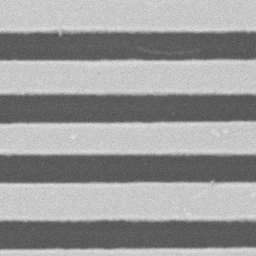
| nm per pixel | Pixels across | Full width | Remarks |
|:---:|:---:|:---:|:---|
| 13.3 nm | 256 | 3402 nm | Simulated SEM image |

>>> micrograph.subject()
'lines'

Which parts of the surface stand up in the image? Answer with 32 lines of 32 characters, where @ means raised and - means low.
@@@@@@@@@@@@@@@@@@@@@@@@@@@@@@@@
@@@@@@@@@@@@@@@@@@@@@@@@@@@@@@@@
@@@@@@@@@@@@@@@@@@@@@@@@@@@@@@@@
@@@@@@@@@@@@@@@@@@@@@@@@@@@@@@@@
--------------------------------
--------------------------------
--------------------------------
--------------------------------
@@@@@@@@@@@@@@@@@@@@@@@@@@@@@@@@
@@@@@@@@@@@@@@@@@@@@@@@@@@@@@@@@
@@@@@@@@@@@@@@@@@@@@@@@@@@@@@@@@
@@@@@@@@@@@@@@@@@@@@@@@@@@@@@@@@
--------------------------------
--------------------------------
--------------------------------
--@@@@@@@@@@@@@@@@@@@@@@@@@@@@@@
@@@@@@@@@@@@@@@@@@@@@@@@@@@@@@@@
@@@@@@@@@@@@@@@@@@@@@@@@@@@@@@@@
@@@@@@@@@@@@@@@@@@@@@@@@@@@@@@@@
--------------------------------
--------------------------------
--------------------------------
--------------------------------
@@@@@@@@@@@@@@@@@@@@@@@@@@@@@@@@
@@@@@@@@@@@@@@@@@@@@@@@@@@@@@@@@
@@@@@@@@@@@@@@@@@@@@@@@@@@@@@@@@
@@@@@@@@@@@@@@@@@@@@@@@@@@@@@@@@
--------------------------------
--------------------------------
--------------------------------
--------------------------------
@@@@@@@@@@@@@@@@@@@@@@@@@@@@@@@@